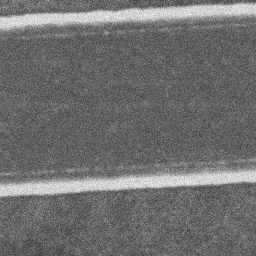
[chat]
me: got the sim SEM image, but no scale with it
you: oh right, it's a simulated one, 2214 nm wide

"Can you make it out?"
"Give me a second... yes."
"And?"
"one or a few lines or trenches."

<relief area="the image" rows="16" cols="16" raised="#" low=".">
................
################
################
################
################
################
################
################
################
################
################
########........
................
................
................
................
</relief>